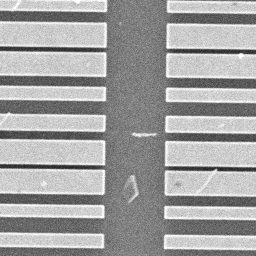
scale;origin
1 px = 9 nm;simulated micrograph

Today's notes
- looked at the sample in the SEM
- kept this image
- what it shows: groups of lines, slits or small figures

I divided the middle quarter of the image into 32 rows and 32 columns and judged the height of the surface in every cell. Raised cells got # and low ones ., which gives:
##########................######
##########................######
##########................######
................................
................................
................................
##########................######
##########................######
##########................######
................................
................................
................................
................................
##########...............#######
##########...............#######
##########...............#######
##########...............#######
................................
................................
##########................######
##########...............#######
##########...............#######
##########...............#######
##########...............#######
##########...............#######
................................
####............................
##########...............#######
##########...............#######
##########...............#######
##########...............#######
##########...............#######